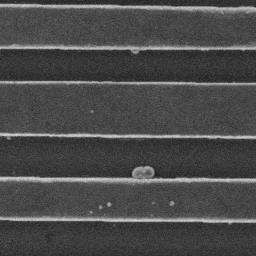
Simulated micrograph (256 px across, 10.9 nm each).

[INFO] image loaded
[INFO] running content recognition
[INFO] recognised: lines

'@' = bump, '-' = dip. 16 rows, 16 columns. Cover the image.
@@@@@@@@@@@@----
@@@@@@@@@@@@@@@@
@@@@@@@@@@@@@@@@
----------------
----------------
@@@@@@@@@@@@@@@@
@@@@@@@@@@@@@@@@
@@@@@@@@@@@@@@@@
------@@@@@@@@@@
----------------
----------------
@@@@@@@@@@@@@@@@
@@@@@@@@@@@@@@@@
@@@@@@@@@@@@@@@@
----------------
----------------